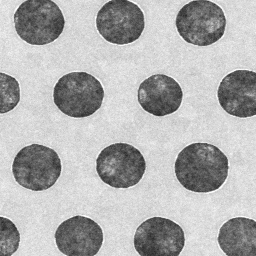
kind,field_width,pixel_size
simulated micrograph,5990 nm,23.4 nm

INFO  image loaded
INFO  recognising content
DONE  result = holes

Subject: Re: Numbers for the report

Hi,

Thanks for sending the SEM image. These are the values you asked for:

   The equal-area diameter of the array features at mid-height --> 1130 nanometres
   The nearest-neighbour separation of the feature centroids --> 1.89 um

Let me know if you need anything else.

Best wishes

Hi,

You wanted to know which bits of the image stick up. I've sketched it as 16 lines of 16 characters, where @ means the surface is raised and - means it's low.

@---@@---@@---@@
@---@@---@@---@@
@--@@@@-@@@@--@@
@@@@@@@@@@@@@@@@
@@@@@@@@@@@@@@--
-@@---@@@--@@@--
-@@---@@@--@@@--
@@@@@@@@@@@@@@@@
@@@@@@@@@@@@@@@@
@--@@@---@@---@@
@---@@---@@---@@
@--@@@@-@@@---@@
@@@@@@@@@@@@@@@@
@@@@@@@@@@@@@@@@
-@@@--@@---@@@--
-@@@--@@---@@@--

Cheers